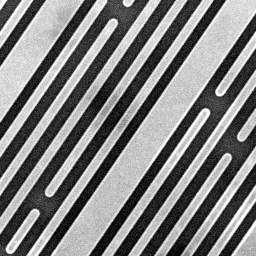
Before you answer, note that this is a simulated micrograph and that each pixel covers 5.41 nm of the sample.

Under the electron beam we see groups of lines, slits or small figures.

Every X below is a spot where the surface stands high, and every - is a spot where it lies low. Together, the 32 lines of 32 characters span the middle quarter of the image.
----XX----XXX----XX----XXX---XXX
---XXX----XX----XXX----XX----XXX
--XXX----XX----XXX----XXX---XXXX
--XX----XXX----XX----XXX---XXXXX
-XX----XXX----XXX----XX----XXXXX
XXX----XXX---XXX----XXX---XXXXXX
XX----XXX----XX----XXX---XXXXXXX
X----XXX----XX-----XX----XXXXXXX
X----XX----XXX----XX----XXXXXXXX
----XXX----XX----XXX---XXXXXXXXX
---XXX----XXX----XX----XXXXXXXXX
---XX----XXX----XX----XXXXXXXXX-
--XXX----XX----XXX---XXXXXXXXX--
-XXX----XX----XXX---XXXXXXXXXX--
-XX----XXX----XX----XXXXXXXXX---
XX----XXX----XXX---XXXXXXXXX----
XX----XX----XXX---XXXXXXXXX----X
X----XXX----XX----XXXXXXXXX----X
X----XX----XXX---XXXXXXXXX----XX
----XX----XXX---XXXXXXXXX----XX-
---XXX----XX----XXXXXXXXX---XXX-
--XXX----XXX---XXXXXXXXX----XX--
--XX----XXX---XXXXXXXXX----XXX--
-XXX---XXX----XXXXXXXXX---XXX---
XXX----XXX---XXXXXXXXX----XX----
XX----XXX---XXXXXXXXXX---XX-----
XX----XX----XXXXXXXXX---XXX----X
X----XX----XXXXXXXXX---XXX----XX
----XXX---XXXXXXXXX----XX----XXX
---XXX----XXXXXXXXX---XXX----XX-
---XX----XXXXXXXXX----XX----XXX-
--XXX---XXXXXXXXX----XX----XXX--